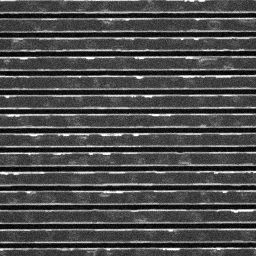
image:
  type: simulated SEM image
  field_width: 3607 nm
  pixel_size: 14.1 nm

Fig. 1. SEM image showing parallel lines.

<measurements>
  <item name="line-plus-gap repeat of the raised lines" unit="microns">0.27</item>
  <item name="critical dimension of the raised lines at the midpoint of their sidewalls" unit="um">0.185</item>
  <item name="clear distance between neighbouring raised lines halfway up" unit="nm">79.2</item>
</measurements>